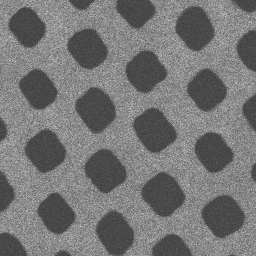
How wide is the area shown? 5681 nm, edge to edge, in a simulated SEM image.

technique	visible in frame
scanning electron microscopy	a regular array of holes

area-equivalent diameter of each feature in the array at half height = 866 nm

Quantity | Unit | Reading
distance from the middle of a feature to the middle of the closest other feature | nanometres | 1380